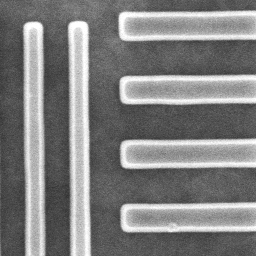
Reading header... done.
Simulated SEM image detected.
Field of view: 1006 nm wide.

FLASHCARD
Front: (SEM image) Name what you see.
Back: groups of lines, slits or small figures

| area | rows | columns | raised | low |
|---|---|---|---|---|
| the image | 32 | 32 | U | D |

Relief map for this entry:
DDDDDDDDDDDDDDDDDDDDDDDDDDDDDDDD
DDDDDDDDDDDDDDDDDDDDDDDDDDDDDDDD
DDDDDDDDDDDDDDDUUUUUUUUUUUUUUUUU
DDDUUDDDDUUDDDDUUUUUUUUUUUUUUUUU
DDDUUDDDDUUDDDDUUUUUUUUUUUUUUUUU
DDDUUDDDDUUDDDDDDDDDDDDDDDDDDDDD
DDDUUDDDDUUDDDDDDDDDDDDDDDDDDDDD
DDDUUDDDDUUDDDDDDDDDDDDDDDDDDDDD
DDDUUDDDDUUDDDDDDDDDDDDDDDDDDDDD
DDDUUDDDDUUDDDDDDDDDDDDDDDDDDDDD
DDDUUDDDDUUDDDDUUUUUUUUUUUUUUUUU
DDDUUDDDDUUDDDDUUUUUUUUUUUUUUUUU
DDDUUDDDDUUDDDDDUUUUUUUUUUUUUUUU
DDDUUDDDDUUDDDDDDDDDDDDDDDDDDDDD
DDDUUDDDDUUDDDDDDDDDDDDDDDDDDDDD
DDDUUDDDDUUDDDDDDDDDDDDDDDDDDDDD
DDDUUDDDDUUDDDDDDDDDDDDDDDDDDDDD
DDDUUDDDDUUDDDDDDDDDDDDDDDDDDDDD
DDDUUDDDDUUDDDDUUUUUUUUUUUUUUUUU
DDDUUDDDDUUDDDDUUUUUUUUUUUUUUUUU
DDDUUDDDDUUDDDDDUUUUUUUUUUUUUUUU
DDDUUDDDDUUDDDDDDDDDDDDDDDDDDDDD
DDDUUDDDDUUDDDDDDDDDDDDDDDDDDDDD
DDDDUDDDDUUDDDDDDDDDDDDDDDDDDDDD
DDDDUDDDDUUDDDDDDDDDDDDDDDDDDDDD
DDDDUDDDDUUDDDDDDDDDDDDDDDDDDDDD
DDDDUDDDDUUDDDDUUUUUUUUUUUUUUUUU
DDDDUDDDDUUDDDDUUUUUUUUUUUUUUUUU
DDDDUDDDDUUDDDDDUUUUUUUUUUUUUUUU
DDDUUDDDDUUDDDDDDDDDDDDDDDDDDDDD
DDDUUDDDDUUDDDDDDDDDDDDDDDDDDDDD
DDDDUDDDDUUDDDDDDDDDDDDDDDDDDDDD